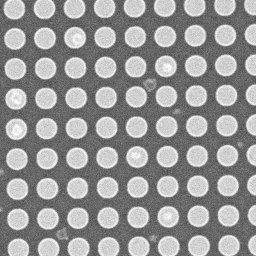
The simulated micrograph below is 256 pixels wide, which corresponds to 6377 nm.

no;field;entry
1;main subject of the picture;an array of small figures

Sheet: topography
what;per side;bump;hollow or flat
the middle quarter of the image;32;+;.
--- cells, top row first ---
+++++...+++++...++++...+++++...+
+++++...+++++...++++...+++++...+
.++++...++++....++++....+++....+
................................
................................
................................
.++++....+++....++++....++++...+
.++++...+++++...++++...+++++...+
.+++++..+++++...++++...+++++...+
.++++...+++++...++++...+++++...+
.++++....+++.....++......+......
................................
................................
..........+......++.....+++.....
.++++....++++...++++....++++...+
.+++++..+++++...+++++..+++++...+
.+++++..+++++...+++++..+++++...+
.++++....++++...++++....+++.....
................................
................................
................................
..+++....+++.....+++....++++...+
.+++++..+++++...+++++..+++++...+
.+++++..+++++...+++++..+++++...+
.+++++...++++...+++++...++++...+
..+++....+++.....+++.....++.....
................................
................................
.................++......++.....
.++++....++++...+++++...++++...+
.+++++..+++++...+++++..+++++...+
.+++++..+++++...+++++...++++...+